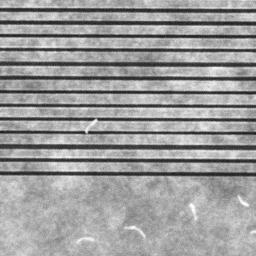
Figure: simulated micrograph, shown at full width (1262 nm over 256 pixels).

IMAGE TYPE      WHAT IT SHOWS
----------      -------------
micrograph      parallel lines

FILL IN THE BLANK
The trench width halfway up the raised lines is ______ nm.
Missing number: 23.4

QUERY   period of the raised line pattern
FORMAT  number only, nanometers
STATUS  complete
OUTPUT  67.4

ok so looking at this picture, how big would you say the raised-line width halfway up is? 43.2 nm